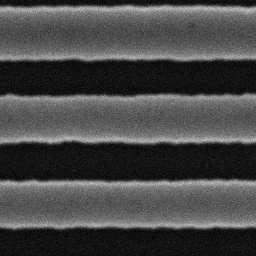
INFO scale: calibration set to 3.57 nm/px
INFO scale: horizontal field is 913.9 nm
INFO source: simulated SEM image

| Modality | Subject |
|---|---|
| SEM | lines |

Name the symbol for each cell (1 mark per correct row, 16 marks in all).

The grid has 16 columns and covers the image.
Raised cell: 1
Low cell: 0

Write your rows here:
1111111111111111
1111111111111111
1111111111111111
1111111111111111
0000000000000000
0000000000000000
1111111111111111
1111111111111111
1111111111111111
0000000000000000
0000000000000000
1111111111111111
1111111111111111
1111111111111111
0000000000000000
0000000000000000